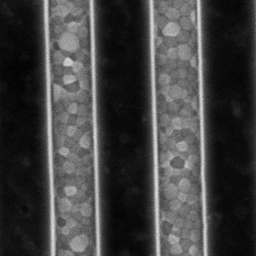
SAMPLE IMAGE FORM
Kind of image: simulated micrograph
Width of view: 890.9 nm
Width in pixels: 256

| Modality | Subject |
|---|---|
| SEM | one or a few lines or trenches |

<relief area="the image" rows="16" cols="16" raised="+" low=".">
+++...++++..++++
+++...++++..++++
+++...++++..++++
+++...++++..++++
+++...++++...+++
+++...++++...+++
+++...++++...+++
+++...++++...+++
+++...++++...+++
+++...++++...+++
+++...++++...+++
+++...++++...+++
+++...++++...+++
+++...++++...+++
+++...++++...+++
+++...++++...+++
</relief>